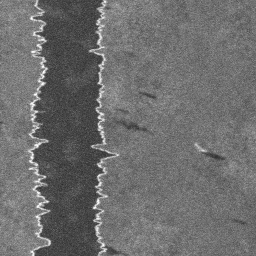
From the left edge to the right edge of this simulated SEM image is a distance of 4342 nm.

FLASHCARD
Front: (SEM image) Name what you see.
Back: one or a few lines or trenches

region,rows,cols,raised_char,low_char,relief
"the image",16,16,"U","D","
DDUUUUDDDDDDDDDD
DDUUUUDDDDDDDDDD
DDUUUUDDDDDDDDDD
DDUUUUDDDDDDDDDD
DDDUUUDDDDDDDDDD
DDUUUUDDDDDDDDDD
DDUUUUDDDDDDDDDD
DDUUUUDDDDDDDDDD
DDUUUUDDDDDDDDDD
DDUUUUUDDDDDDDDD
DDUUUUDDDDDDDDDD
DDUUUUDDDDDDDDDD
DDDUUUDDDDDDDDDD
DDDUUUDDDDDDDDDD
DDDUUUDDDDDDDDDD
DDUUUUDDDDDDDDDD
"